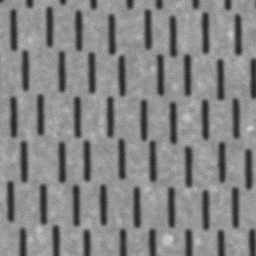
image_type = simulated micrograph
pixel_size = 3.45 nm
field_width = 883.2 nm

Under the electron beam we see a regular array of holes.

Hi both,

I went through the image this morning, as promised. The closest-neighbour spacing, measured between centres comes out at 103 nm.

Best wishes